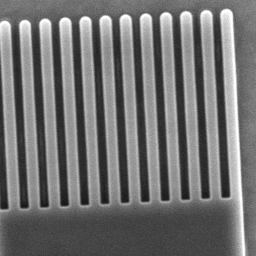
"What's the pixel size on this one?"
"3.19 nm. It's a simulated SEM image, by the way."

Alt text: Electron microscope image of groups of lines, slits or small figures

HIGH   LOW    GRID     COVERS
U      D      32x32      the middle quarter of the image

UUDDDUUDDDUUDDDUUDDDUUDDDUUUDDUU
UUDDDUUDDDUUDDDUUDDDUUDDDUUUDDUU
UUDDDUUDDDUUDDDUUUDDUUUDDUUUDDUU
UUDDDUUDDDUUDDDUUUDDUUUDDUUUDDUU
UUDDDUUUDDUUUDDUUUDDUUUDDUUUDDUU
UUDDDUUUDDUUUDDUUUDDUUUDDUUUDDUU
UUUDDUUUDDUUUDDUUUDDUUUDDUUUDDUU
UUUDDUUUDDUUUDDUUUDDUUUDDUUUDDUU
UUUDDUUUDDUUUDDUUUDDUUUDDUUUDDUU
UUUDDUUUDDUUUDDUUUDDUUUDDUUUDDUU
UUUDDUUUDDUUUDDUUUDDUUUDDUUUDDUU
UUUDDUUUDDUUUDDUUUDDUUUDDUUUDDUU
UUUDDUUUDDUUUDDUUUDDUUUDDUUUDDDU
UUUDDUUUDDUUUDDUUUDDUUUDDDUUDDDU
UUUDDUUUDDUUUDDUUUDDDUUDDDUUDDDU
UUUDDUUUDDUUUDDDUUDDDUUDDDUUDDDU
UUUDDUUUDDDUUDDDUUDDDUUDDDUUDDDU
UUUDDDUUDDDUUDDDUUDDDUUDDDUUDDDU
DUUDDDUUDDDUUDDDUUDDDUUDDDUUDDDU
DUUDDDUUDDDUUDDDUUDDDUUDDDUUDDDU
DUUDDDUUDDDUUDDDUUDDDUUDDDUUDDDU
DUUDDDUUDDDUUDDDUUDDDUUDDDUUDDDU
DUUDDDUUDDDUUDDDUUDDDUUDDDUUUDDU
DUUDDDUUDDDUUDDDUUDDDUUUDDUUUDDU
DUUDDDUUDDDUUDDDUUUDDUUUDDUUUDDU
DUUDDDUUDDDUUDDDUUUDDUUUDDUUUDDU
DUUDDDUUDDDUUUDDUUUDDUUUDDUUUDDU
DUUDDDUUUDDUUUDDUUUDDUUUDDUUUDDU
DUUUDDUUUDDUUUDDUUUDDUUUDDUUUDDU
DUUUDDUUUDDUUUDDUUUDDUUUDDUUUDDU
DUUUDDUUUDDUUUDDUUUDDUUUDDUUUDDU
DUUUDDUUUDDUUUDDUUUDDUUUDDUUUDDU